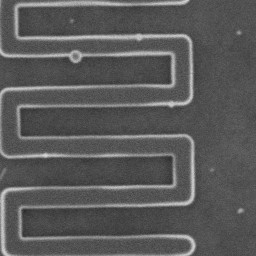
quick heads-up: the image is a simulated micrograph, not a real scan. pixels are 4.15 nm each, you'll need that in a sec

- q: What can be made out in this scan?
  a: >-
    groups of lines, slits or small figures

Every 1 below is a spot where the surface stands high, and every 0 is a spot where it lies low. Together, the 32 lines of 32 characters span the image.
11111111000001111111000000000000
11000000000000000000000000000000
11000000000000000000000000000000
11000000000000000000000000000000
11000000000000000100001000000000
11111111111111111111111100000000
11111111111111111111111100000000
00000000010000000000001100000000
00000000000000000000001100000000
00000000000000000000001100000000
00000000000000000000011100000000
11111111111111111111111100000000
11111111111111111111111100000000
11100000000000000000000000000000
11000000000000000000000000000000
11000000000000000000000000000000
11000000000000000000000000000000
11111111111111111111111100000000
11111111111111111111111100000000
01111100111110000000011100000000
00000000000000000000001100000000
00000000000000000000001100000000
00000000000000000000001100000000
00001111111111111111111100000000
11111111111111111111111100000000
11111111111111111111110000000000
11100000000000000000000000000000
11100000000000000000000000000000
11100000000000000000000000000000
11100000000000000011110000000000
11111111111111111111111100000000
11111111111111111111111100000000